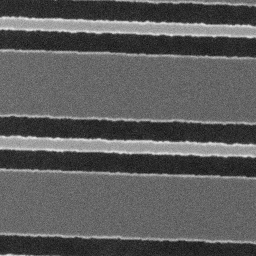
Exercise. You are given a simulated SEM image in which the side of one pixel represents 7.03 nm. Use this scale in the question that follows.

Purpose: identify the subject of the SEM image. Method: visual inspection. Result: lines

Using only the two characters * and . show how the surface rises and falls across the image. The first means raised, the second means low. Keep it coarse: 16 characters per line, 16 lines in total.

................
................
................
***********.....
****************
****************
****************
........********
................
................
................
****************
****************
****************
****************
................